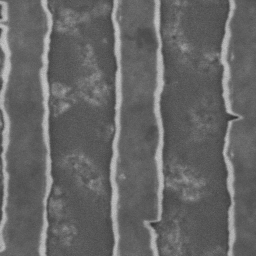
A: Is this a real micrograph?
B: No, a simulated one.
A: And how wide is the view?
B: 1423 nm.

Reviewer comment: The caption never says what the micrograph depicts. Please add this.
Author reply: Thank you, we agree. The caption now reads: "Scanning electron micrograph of one or a few lines or trenches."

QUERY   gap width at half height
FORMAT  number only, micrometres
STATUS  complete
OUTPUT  0.383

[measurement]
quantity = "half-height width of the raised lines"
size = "238 nanometres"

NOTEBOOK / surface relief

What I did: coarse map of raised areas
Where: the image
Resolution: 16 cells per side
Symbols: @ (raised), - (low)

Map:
@@@----@@@----@@
@@@----@@@----@@
@@@----@@@----@@
@@@----@@@----@@
@@@----@@@----@@
@@@----@@@----@@
@@@----@@@----@@
@@@----@@@-----@
@@@----@@@----@@
@@@----@@@----@@
@@@----@@@----@@
@@@----@@@----@@
@@@----@@@----@@
@@@----@@@----@@
@@@----@@@----@@
@@@----@@@----@@